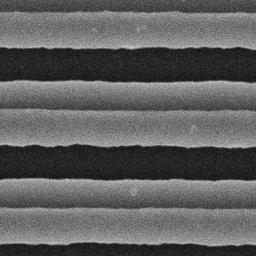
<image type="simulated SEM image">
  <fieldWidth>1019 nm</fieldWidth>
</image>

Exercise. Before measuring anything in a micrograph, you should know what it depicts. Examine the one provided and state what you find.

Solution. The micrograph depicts lines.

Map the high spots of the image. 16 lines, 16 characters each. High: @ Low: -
@@@@@@@@@@@@@@@@
@@@@@@@@@@@@@@@@
@@@@@@@@@@@@@@@@
----------------
----------------
@@@@@@@@@@@@@@@@
@@@@@@@@@@@@@@@@
@@@@@@@@@@@@@@@@
@@@@@@@@@@@@@@@@
----------------
----------------
@@@@@@@@@@@@@@@@
@@@@@@@@@@@@@@@@
@@@@@@@@@@@@@@@@
@@@@@@@@@@@@@@@@
----------------